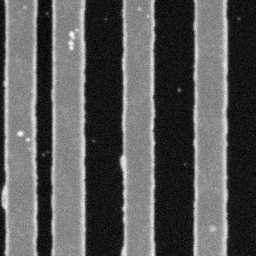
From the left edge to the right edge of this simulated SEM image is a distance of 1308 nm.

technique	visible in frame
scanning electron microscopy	lines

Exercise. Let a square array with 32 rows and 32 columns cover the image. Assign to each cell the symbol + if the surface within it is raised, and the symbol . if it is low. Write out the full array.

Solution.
.++++..++++....++++.....++++....
.++++..+++.....++++.....++++....
.+++...+++.....++++.....++++....
.+++...+++.....++++.....++++....
.+++...+++.....++++.....++++....
.+++...++++....++++.....++++....
.+++...++++....++++.....++++....
.+++...++++....++++.....++++....
.+++...++++....++++.....++++....
.+++...++++....++++.....++++....
.+++...+++.....++++.....++++....
.+++...+++.....++++.....++++....
.+++...+++.....++++.....++++....
.+++...+++.....++++.....++++....
.+++...+++.....++++.....++++....
.+++...+++.....++++.....++++....
.+++...+++.....++++.....++++....
.+++...++++....++++.....++++....
.+++...++++....++++.....++++....
.+++...++++....++++.....++++....
.+++...+++.....++++.....++++....
.+++...++++....++++.....++++....
.+++...+++.....++++.....++++....
.+++...++++.....+++.....++++....
++++...++++....++++.....++++....
.++++..++++.....+++.....++++....
.++++..++++.....+++.....++++....
.+++...++++....++++.....++++....
.++++..++++.....+++.....++++....
.++++..++++.....+++.....++++....
.+++...++++.....+++.....++++....
.+++...++++.....+++.....++++....